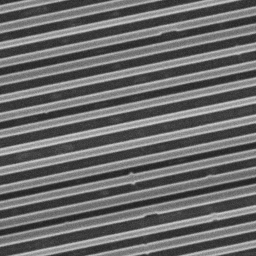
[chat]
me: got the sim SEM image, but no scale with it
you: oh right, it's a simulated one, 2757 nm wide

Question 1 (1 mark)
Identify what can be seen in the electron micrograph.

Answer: parallel lines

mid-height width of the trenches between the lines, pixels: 9.92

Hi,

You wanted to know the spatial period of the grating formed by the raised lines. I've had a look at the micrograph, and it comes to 189 nanometres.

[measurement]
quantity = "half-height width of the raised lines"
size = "84.3 nanometers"